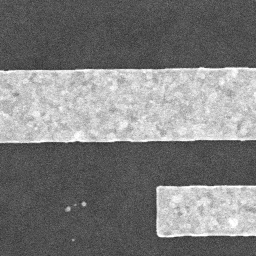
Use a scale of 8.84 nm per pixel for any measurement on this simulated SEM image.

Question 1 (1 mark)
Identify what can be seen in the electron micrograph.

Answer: wiring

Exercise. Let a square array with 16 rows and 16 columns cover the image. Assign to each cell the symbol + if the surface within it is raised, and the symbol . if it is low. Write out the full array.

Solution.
................
................
................
................
++++++++++++++++
++++++++++++++++
++++++++++++++++
++++++++++++++++
++++++++++++++++
................
................
................
..........++++++
..........++++++
..........++++++
................